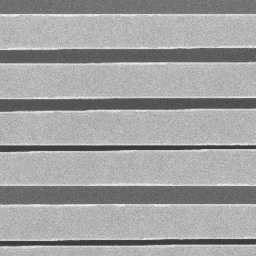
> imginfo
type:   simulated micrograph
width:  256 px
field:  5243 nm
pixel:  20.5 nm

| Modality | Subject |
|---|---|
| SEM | lines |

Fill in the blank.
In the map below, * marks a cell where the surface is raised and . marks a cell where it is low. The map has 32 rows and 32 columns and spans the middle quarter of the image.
********************************
********************************
********************************
********************************
********************************
********************************
********************************
********************************
************....................
................................
................................
............................****
********************************
********************************
********************************
********************************
********************************
********************************
********************************
********************************
................................
.............................***
********************************
********************************
********************************
********************************
********************************
********************************
********************************
********************************
................................
................................